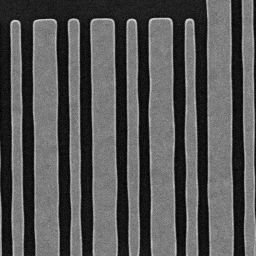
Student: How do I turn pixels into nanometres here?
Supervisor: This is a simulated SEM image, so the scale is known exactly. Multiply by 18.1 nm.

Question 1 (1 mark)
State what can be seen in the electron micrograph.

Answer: groups of lines, slits or small figures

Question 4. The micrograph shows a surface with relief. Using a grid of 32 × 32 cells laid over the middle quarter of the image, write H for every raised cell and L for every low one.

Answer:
LHHHLLLHHHHHHLLLHHLLLHHHHHHLLLHH
LHHHLLLHHHHHHLLLHHLLLHHHHHHLLLLH
LHHHLLLHHHHHHLLLHHLLLHHHHHHLLLLH
LHHHLLLHHHHHHLLLHHLLLLHHHHHLLLLH
LHHHLLLHHHHHHLLLHHLLLLHHHHHLLLLH
LHHHLLLHHHHHHLLLHHLLLLHHHHHLLLLH
LHHHLLLHHHHHHLLLHHLLLLHHHHHLLLLH
LHHHLLLHHHHHHLLLHHLLLLHHHHHLLLLH
LHHHLLLHHHHHHLLLHHLLLHHHHHHLLLLH
LHHHLLLHHHHHHLLLHHHLLHHHHHHLLLLH
LLHHLLLHHHHHHLLLHHHLLHHHHHHLLLLH
LLHHLLLHHHHHHLLLHHHLLHHHHHHLLLLH
LLHHLLLHHHHHHLLLHHHLLHHHHHHLLLLH
LLHHLLLHHHHHHLLLHHHLLHHHHHHLLLLH
LLHHLLLHHHHHHLLLHHHLLHHHHHHLLLHH
LLHHLLLHHHHHHLLLHHHLLHHHHHHLLLHH
LLHHLLLHHHHHHLLLHHHLLHHHHHHLLLHH
LLHHLLLHHHHHHLLLHHHLLHHHHHHLLLHH
LLHHLLLHHHHHHLLLHHHLLHHHHHHLLLHH
LLHHLLLHHHHHHLLLHHHLLLHHHHHLLLHH
LLHHLLLHHHHHHLLLHHHLLLHHHHHLLLHH
LLHHLLLHHHHHHLLLHHHLLLHHHHHLLLLH
LLHHLLLHHHHHHLLLHHHLLLHHHHHLLLLH
LLHHLLLHHHHHHLLLHHHLLLHHHHHLLLLH
LLHHLLLHHHHHHLLLHHHLLLHHHHHLLLLH
LLHHLLLHHHHHHLLLHHHLLLHHHHHLLLLH
LLHHLLLHHHHHHLLLHHHLLLHHHHHLLLLH
LLHHLLLHHHHHHLLLHHHLLLHHHHHLLLLH
LLHHLLLHHHHHHLLLHHHLLLHHHHHLLLLH
LLHHLLLHHHHHHLLLHHHLLLHHHHHLLLLH
LLHHLLLHHHHHHLLLHHHLLLHHHHHLLLLH
LLHHLLLHHHHHHLLLHHHLLLHHHHHLLLLH